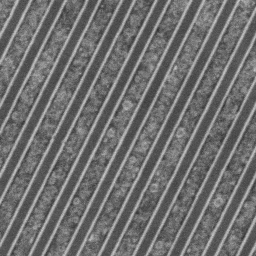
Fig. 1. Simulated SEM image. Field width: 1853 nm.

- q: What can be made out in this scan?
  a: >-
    parallel lines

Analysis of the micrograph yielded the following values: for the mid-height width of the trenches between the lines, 144 nm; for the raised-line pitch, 0.225 µm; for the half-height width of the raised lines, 79.5 nm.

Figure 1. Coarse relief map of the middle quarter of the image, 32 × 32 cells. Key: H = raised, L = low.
HLLLLLHHHLLLLLLHHHLLLLLHHHHLLLLL
LLLLLLHHHLLLLLHHHHLLLLLHHHLLLLLL
LLLLLHHHLLLLLLHHHLLLLLLHHHLLLLLH
LLLLLHHHLLLLLHHHHLLLLLHHHLLLLLLH
LLLLHHHLLLLLLHHHLLLLLHHHHLLLLLHH
LLLLHHHLLLLLHHHHLLLLLHHHLLLLLLHH
LLLHHHLLLLLLHHHLLLLLLHHHLLLLLHHH
LLLHHHLLLLLHHHHLLLLLHHHLLLLLLHHH
LLHHHLLLLLLHHHLLLLLLHHHLLLLLHHHL
LLHHHLLLLLHHHHLLLLLHHHHLLLLLHHHL
LHHHLLLLLLHHHLLLLLLHHHLLLLLHHHLL
LHHHLLLLLHHHHLLLLLHHHHLLLLLHHHLL
HHHLLLLLLHHHLLLLLLHHHLLLLLHHHHLL
HHHLLLLLHHHHLLLLLHHHHLLLLLHHHLLL
HHLLLLLLHHHLLLLLLHHHLLLLLHHHHLLL
HHLLLLLHHHHLLLLLHHHLLLLLLHHHLLLL
HLLLLLLHHHLLLLLLHHHLLLLLHHHHLLLL
HLLLLLHHHHLLLLLHHHHLLLLLHHHLLLLL
LLLLLLHHHLLLLLLHHHLLLLLHHHLLLLLL
LLLLLHHHHLLLLLHHHHLLLLLHHHLLLLLH
LLLLLHHHLLLLLLHHHLLLLLHHHLLLLLLH
LLLLHHHHLLLLLHHHLLLLLLHHHLLLLLLH
LLLLHHHLLLLLLHHHLLLLLHHHHLLLLLHH
LLLHHHHLLLLLHHHLLLLLLHHHLLLLLHHH
LLLHHHLLLLLLHHHLLLLLHHHHLLLLLHHH
LLHHHHLLLLLHHHLLLLLLHHHLLLLLLHHH
LLHHHLLLLLLHHHLLLLLHHHLLLLLLHHHL
LHHHHLLLLLHHHLLLLLLHHHLLLLLLHHHL
LHHHLLLLLLHHHLLLLLLHHLLLLLLHHHLL
HHHHLLLLLHHHLLLLLLHHHLLLLLLHHHLL
HHHLLLLLLHHHLLLLLHHHHLLLLLHHHLLL
HHHLLLLLHHHLLLLLLHHHLLLLLLHHHLLL